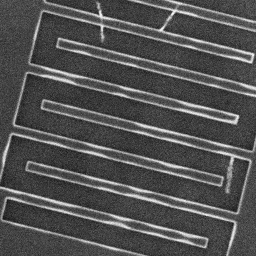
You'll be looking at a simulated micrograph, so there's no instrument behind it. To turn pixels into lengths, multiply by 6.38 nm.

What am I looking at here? groups of lines, slits or small figures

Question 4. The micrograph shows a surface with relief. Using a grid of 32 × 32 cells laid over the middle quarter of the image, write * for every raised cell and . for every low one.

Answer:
..................*********.....
.....................**********.
*........................*******
******.......................***
.*********......................
....**********..................
........*********...............
............**********..........
................**********......
....................*********...
*........................*******
******.......................***
*********.......................
....**********..................
.......**********...............
...........*********............
................*********.......
....................*********...
........................********
*****.......................****
********........................
...**********...................
........*********...............
...........*********............
...............*********........
...................********.....
.......................*********
****.......................*****
*******........................*
..**********....................
......**********................
..........*********.............